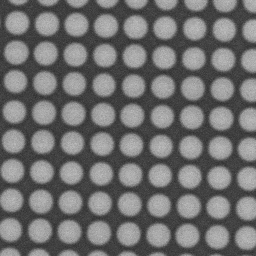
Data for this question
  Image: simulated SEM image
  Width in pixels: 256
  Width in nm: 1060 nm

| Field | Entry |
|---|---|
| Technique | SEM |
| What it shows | an array of small figures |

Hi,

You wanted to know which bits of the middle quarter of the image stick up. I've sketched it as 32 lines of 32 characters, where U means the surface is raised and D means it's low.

DDDDDDDDDUUDDDDDUUUDDDDUUUUDDDUU
DDDDDDDDDDDDDDDDDDDDDDDDDDDDDDDD
DUUUDDDDDDDDDDDDDDDDDDDDDDDDDDDD
UUUUUDDDUUUUDDDUUUUDDDDUUUUDDDDU
UUUUUDDUUUUUUDDUUUUUDDUUUUUDDDUU
UUUUUDDUUUUUUDDUUUUUDDUUUUUUDUUU
UUUUUDDUUUUUUDDUUUUUDDUUUUUUDUUU
DUUUDDDDUUUUDDDUUUUDDDDUUUUDDDUU
DDDDDDDDDDDDDDDDDDDDDDDDUUDDDDDU
DDDDDDDDDDDDDDDDDDDDDDDDDDDDDDDD
UUUUUDDDUUUUDDDDUUUDDDDDUUDDDDDU
UUUUUDDUUUUUDDDUUUUUDDUUUUUDDDUU
UUUUUDDUUUUUUDUUUUUUDDUUUUUDDUUU
UUUUUDDUUUUUUDUUUUUUDDUUUUUDDUUU
UUUUDDDDUUUUDDDUUUUDDDUUUUUDDUUU
DDDDDDDDDUDDDDDDUUDDDDDUUUDDDDUU
DDDDDDDDDDDDDDDDDDDDDDDDDDDDDDDD
UUUUDDDDUUUDDDDDUUDDDDDDDDDDDDDD
UUUUUDDUUUUUDDDUUUUDDDUUUUDDDDUU
UUUUUDDUUUUUDDUUUUUUDDUUUUUDDUUU
UUUUUDDUUUUUDDUUUUUUDDUUUUUDDUUU
UUUUDDDUUUUUDDUUUUUDDDUUUUUDDUUU
DUUDDDDDUUUDDDDUUUUDDDUUUUDDDUUU
DDDDDDDDDDDDDDDDDDDDDDDDDDDDDDDU
DDDDDDDDDDDDDDDDDDDDDDDDDDDDDDDD
UUUUDDDUUUUDDDDUUUUDDDDUUDDDDDUU
UUUUDDDUUUUUDDUUUUUDDDUUUUDDDUUU
UUUUUDDUUUUUDDUUUUUDDUUUUUUDDUUU
UUUUDDDUUUUUDDUUUUUDDUUUUUUDDUUU
UUUUDDDUUUUDDDUUUUUDDDUUUUDDDUUU
DDDDDDDDDDDDDDDDDDDDDDDUUDDDDDUU
DDDDDDDDDDDDDDDDDDDDDDDDDDDDDDDD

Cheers